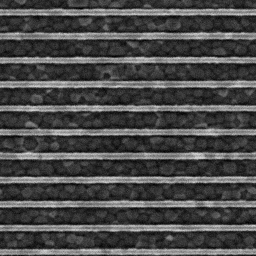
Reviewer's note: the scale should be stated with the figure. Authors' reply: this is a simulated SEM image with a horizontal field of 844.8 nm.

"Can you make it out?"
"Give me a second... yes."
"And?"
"parallel lines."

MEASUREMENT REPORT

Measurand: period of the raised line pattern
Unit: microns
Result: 0.0791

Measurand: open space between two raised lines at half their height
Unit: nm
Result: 62.3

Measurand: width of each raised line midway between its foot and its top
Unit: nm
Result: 18.6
